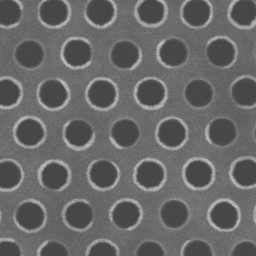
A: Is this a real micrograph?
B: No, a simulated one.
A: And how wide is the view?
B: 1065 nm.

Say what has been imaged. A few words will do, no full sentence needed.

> a regular array of holes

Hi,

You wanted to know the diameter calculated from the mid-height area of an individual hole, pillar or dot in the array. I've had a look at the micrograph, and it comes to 108 nm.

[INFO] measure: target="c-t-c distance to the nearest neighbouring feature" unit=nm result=192